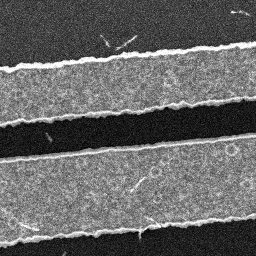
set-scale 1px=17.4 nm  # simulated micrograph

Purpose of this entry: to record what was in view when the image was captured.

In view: one or a few lines or trenches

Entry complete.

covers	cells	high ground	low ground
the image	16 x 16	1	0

0000000000000000
0000000000000000
0000000000000000
0000000111111111
1111111111111111
1111111111111111
1111111111111000
1110000000000000
0000000000000001
0000011111111111
1111111111111111
1111111111111111
1111111111111111
1111111111111111
1111111000000000
0000000000000000